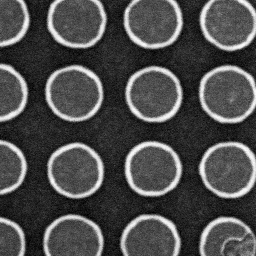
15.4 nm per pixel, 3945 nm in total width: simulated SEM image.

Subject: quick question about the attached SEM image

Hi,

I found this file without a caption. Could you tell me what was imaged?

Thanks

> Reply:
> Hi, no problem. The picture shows raised bodies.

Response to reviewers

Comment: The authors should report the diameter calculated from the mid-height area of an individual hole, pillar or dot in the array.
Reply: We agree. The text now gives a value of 816 nanometres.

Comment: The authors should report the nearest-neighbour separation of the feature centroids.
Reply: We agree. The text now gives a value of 1170 nm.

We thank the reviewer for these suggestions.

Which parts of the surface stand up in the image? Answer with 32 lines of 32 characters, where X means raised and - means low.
XXX----XXXXX----XXXXXX----XXXXX-
XXX---XXXXXXX---XXXXXX---XXXXXXX
XXX---XXXXXXX---XXXXXXX--XXXXXXX
XXX---XXXXXXX---XXXXXX---XXXXXXX
XXX----XXXXX----XXXXXX----XXXXXX
X-------XXX-------XXX------XXXX-
--------------------------------
--------------------------------
X--------X----------------------
XX-----XXXXX-----XXXXX----XXXXX-
XXX---XXXXXX----XXXXXX---XXXXXXX
XXX---XXXXXXX---XXXXXXX--XXXXXXX
XXX---XXXXXXX---XXXXXX---XXXXXXX
XXX----XXXXX----XXXXXX----XXXXXX
XX------XXX------XXXX------XXXX-
--------------------------------
--------------------------------
--------------------------------
XX------XXX------XXXX------XXXX-
XXX----XXXXX----XXXXXX----XXXXX-
XXX---XXXXXXX---XXXXXX---XXXXXXX
XXX---XXXXXXX---XXXXXX---XXXXXXX
XXX---XXXXXXX---XXXXXX----XXXXXX
XX-----XXXXX-----XXXX-----XXXXX-
---------X------------------X---
--------------------------------
--------------------------------
X------XXXX------XXXX------XX---
XX----XXXXXX----XXXXXX----XXXXX-
XXX---XXXXXXX--XXXXXXX---XXXXXX-
XXX---XXXXXXX--XXXXXXX---XXX----
XXX---XXXXXXX--XXXXXXX---XXX----